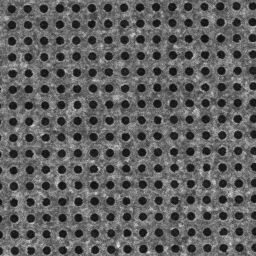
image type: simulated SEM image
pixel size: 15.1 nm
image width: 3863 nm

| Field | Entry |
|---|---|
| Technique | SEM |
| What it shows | a regular array of holes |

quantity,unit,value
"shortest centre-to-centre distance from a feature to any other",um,0.237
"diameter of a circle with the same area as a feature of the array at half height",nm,134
